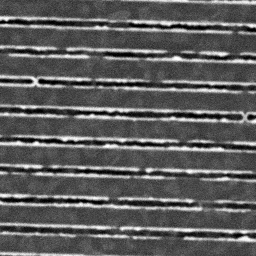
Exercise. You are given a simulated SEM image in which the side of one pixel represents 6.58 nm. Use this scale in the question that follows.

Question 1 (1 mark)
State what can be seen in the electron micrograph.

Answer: parallel lines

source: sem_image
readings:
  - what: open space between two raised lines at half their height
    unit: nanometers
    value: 36.2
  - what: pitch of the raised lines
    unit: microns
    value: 0.195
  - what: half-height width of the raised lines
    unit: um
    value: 0.16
